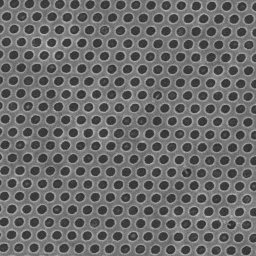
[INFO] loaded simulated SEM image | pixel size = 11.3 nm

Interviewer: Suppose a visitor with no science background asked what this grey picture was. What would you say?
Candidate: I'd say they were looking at a regular array of holes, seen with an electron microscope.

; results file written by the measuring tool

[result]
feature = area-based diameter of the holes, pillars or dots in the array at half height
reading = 9.24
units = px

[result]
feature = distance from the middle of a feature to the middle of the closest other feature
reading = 165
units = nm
